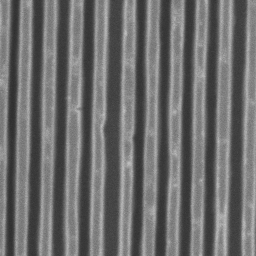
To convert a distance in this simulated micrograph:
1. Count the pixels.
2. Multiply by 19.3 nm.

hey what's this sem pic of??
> parallel lines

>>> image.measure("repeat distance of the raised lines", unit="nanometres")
484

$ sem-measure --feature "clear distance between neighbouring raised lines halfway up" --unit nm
234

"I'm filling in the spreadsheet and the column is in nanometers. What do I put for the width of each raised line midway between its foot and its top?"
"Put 236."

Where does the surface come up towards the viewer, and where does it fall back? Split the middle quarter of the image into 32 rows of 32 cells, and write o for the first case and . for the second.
.ooo....oo.....ooo...ooo...ooo..
.ooo....oo.....ooo..oooo...ooo..
.ooo....oo.....ooo...ooo...ooo..
.ooo....oo.....ooo...oo....ooo..
.ooo....oo.....ooo...oo....ooo..
.ooo....oo.....ooo...oo...oooo..
.ooo....oo.....ooo...oo...ooo...
.ooo....oo.....ooo...oo...ooo...
.ooo...ooo....oooo...oo...ooo...
.ooo...ooo....oooo...oo...ooo...
.ooo...ooo....ooo....oo...ooo...
.ooo...ooo....ooo....oo...ooo...
.ooo...ooo....ooo....oo...ooo...
.ooo...ooo.....oo....oo...ooo...
.ooo...ooo.....oo....oo...ooo...
.ooo...ooo.....oo....oo...ooo...
.ooo...ooo.....oo...ooo...ooo...
.ooo...ooo.....oo...ooo...ooo...
.ooo...ooo.....oo...ooo...ooo...
.ooo...ooo....ooo...ooo...ooo...
.ooo...ooo....ooo...ooo...ooo...
.ooo...ooo....ooo...ooo...ooo...
.ooo...ooo....ooo...ooo....oo...
.ooo...ooo.....oo...ooo....oo...
.ooo...ooo.....oo...ooo....oo...
.ooo...ooo.....oo...ooo....oo...
.ooo...ooo.....oo...ooo...ooo...
.ooo...ooo.....oo...ooo...ooo...
.ooo...ooo.....oo...ooo...ooo...
oooo...ooo....ooo...ooo...ooo...
ooo....ooo....ooo...ooo...ooo...
ooo....ooo....ooo...ooo...ooo...